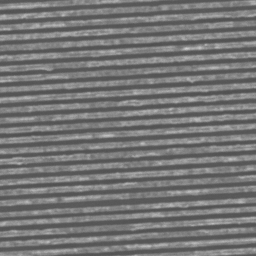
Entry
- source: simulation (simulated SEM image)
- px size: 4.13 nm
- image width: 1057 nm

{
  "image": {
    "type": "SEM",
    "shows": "parallel lines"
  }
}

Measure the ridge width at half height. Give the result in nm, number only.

22.2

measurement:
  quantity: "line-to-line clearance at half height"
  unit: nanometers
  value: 22.2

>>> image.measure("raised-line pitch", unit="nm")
42.6